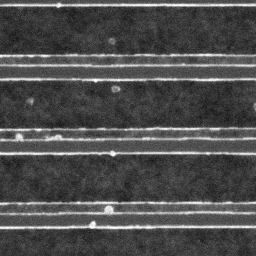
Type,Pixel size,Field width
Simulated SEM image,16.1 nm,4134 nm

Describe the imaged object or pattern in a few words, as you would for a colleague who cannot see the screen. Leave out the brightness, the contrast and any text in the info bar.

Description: lines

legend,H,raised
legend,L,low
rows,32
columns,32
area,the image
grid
HHHHHHHHHHHHHHHHHHHHHHHHHHHHHHHH
LLLLLLLLLLLLLLLLLLLLLLLLLLLLLLLL
LLLLLLLLLLLLLLLLLLLLLLLLLLLLLLLL
LLLLLLLLLLLLLLLLLLLLLLLLLLLLLLLL
LLLLLLLLLLLLLLLLLLLLLLLLLLLLLLLL
LLLLLLLLLLLLLLLLLLLLLLLLLLLLLLLL
LLLLLLLLLLLLLLLLLLLLLLLLLLLLLLLL
HHHHHHHHHHHHHHHHHHHHHHHHHHHHHHHH
HHHHHHHHHHHHHHHHHHHHHHHHHHHHHHHH
HHHHHHHHHHHHHHHHHHHHHHHHHHHHHHHH
LLLLLLLLLLLLLLLLLLLLLLLLLLLLLLLL
LLLLLLLLLLLLLLLLLLLLLLLLLLLLLLLL
LLLLLLLLLLLLLLLLLLLLLLLLLLLLLLLL
LLLLLLLLLLLLLLLLLLLLLLLLLLLLLLLL
LLLLLLLLLLLLLLLLLLLLLLLLLLLLLLLL
LLLLLLLLLLLLLLLLLLLLLLLLLLLLLLLL
HHHHHHHHHHHHHHHHHHHHHHHHHHHHHHHH
HHHHHHHHHHHHHHHHHHHHHHHHHHHHHHHH
HHHHHHHHHHHHHHHHHHHHHHHHHHHHHHHH
LLLLLLLLLLLLLLLLLLLLLLLLLLLLLLLL
LLLLLLLLLLLLLLLLLLLLLLLLLLLLLLLL
LLLLLLLLLLLLLLLLLLLLLLLLLLLLLLLL
LLLLLLLLLLLLLLLLLLLLLLLLLLLLLLLL
LLLLLLLLLLLLLLLLLLLLLLLLLLLLLLLL
LLLLLLLLLLLLLLLLLLLLLLLLLLLLLLLL
HHHHHHHHHHHHHHHHHHHHHHHHHHHHHHHH
HHHHHHHHHHHHHHHHHHHHHHHHHHHHHHHH
HHHHHHHHHHHHHHHHHHHHHHHHHHHHHHHH
LLLLLLLLLLLHLLLLLLLLLLLLLLLLLLLL
LLLLLLLLLLLLLLLLLLLLLLLLLLLLLLLL
LLLLLLLLLLLLLLLLLLLLLLLLLLLLLLLL
LLLLLLLLLLLLLLLLLLLLLLLLLLLLLLLL